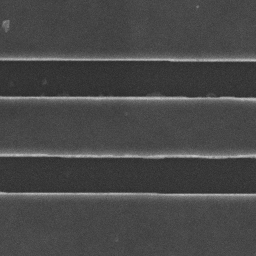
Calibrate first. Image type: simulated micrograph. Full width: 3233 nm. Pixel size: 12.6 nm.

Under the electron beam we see lines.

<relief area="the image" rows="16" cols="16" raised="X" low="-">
XXXXXXXXXXXXXXXX
XXXXXXXXXXXXXXXX
XXXXXXXXXXXXXXXX
XXXXXXXXXXXXXXXX
----------------
----------------
XXXXXXXXXXXXXXXX
XXXXXXXXXXXXXXXX
XXXXXXXXXXXXXXXX
XXXXXXXXXXXXXXXX
----------------
----------------
XXXXXXXXXXXXXXXX
XXXXXXXXXXXXXXXX
XXXXXXXXXXXXXXXX
XXXXXXXXXXXXXXXX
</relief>